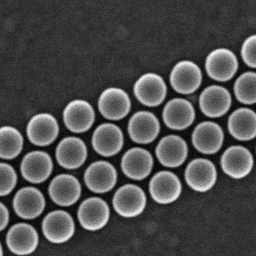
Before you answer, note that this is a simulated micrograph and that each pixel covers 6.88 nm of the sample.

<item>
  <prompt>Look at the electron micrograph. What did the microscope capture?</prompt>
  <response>a regular array of raised bodies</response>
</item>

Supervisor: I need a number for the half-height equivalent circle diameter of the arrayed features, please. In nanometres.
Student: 209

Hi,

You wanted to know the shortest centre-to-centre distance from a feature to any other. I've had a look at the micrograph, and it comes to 253 nm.